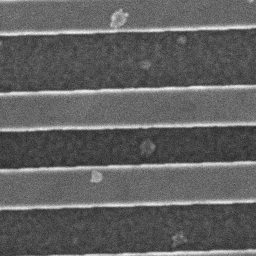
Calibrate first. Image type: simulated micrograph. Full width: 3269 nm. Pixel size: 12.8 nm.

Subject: lines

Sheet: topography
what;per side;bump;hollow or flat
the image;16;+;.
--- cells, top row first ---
++++++++++++++++
++++++++++++++++
................
................
................
..........++++++
++++++++++++++++
++++++++++++++++
................
................
...+++++++++++++
++++++++++++++++
++++++++++++++++
................
................
................